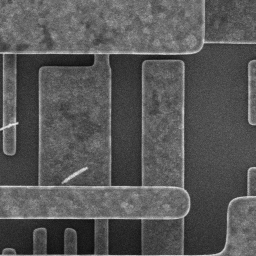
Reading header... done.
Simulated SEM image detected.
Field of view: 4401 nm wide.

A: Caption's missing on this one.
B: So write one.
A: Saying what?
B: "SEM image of wiring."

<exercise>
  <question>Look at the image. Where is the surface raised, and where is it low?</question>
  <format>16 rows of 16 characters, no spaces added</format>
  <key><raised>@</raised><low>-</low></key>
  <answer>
@@@@@@@@@@@@@---
@@@@@@@@@@@@@---
@@@@@@@@@@@@@---
----------------
----------------
----------------
----------------
----------------
----------------
----------------
----------------
----------------
@@@@@@@@@@@@---@
@@@@@@@@@@@---@@
--------------@@
--------------@@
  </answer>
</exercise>